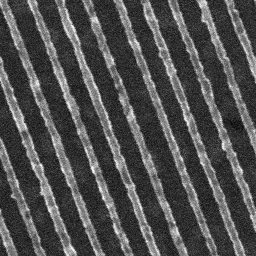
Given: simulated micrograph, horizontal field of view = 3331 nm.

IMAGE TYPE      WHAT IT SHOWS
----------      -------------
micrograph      parallel lines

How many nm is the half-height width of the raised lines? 85.1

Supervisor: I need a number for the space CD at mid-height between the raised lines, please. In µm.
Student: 0.255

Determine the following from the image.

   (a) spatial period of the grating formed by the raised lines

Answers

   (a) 345 nm